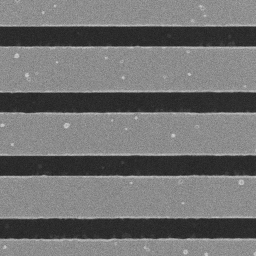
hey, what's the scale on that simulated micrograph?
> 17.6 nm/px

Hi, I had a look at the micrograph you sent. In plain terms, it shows lines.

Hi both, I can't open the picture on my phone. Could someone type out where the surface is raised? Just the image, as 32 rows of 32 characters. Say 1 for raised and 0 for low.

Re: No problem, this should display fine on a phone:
11111111111111111111111111111111
11111111111111111111111111111111
11111111111111111111111111111111
00000000000000000000000000000000
00000000000000000000000000000000
00000000000000000000000000000000
11111111111111111111111111111111
11111111111111111111111111111111
11111111111111111111111111111111
11111111111111111111111111111111
11111111111111111111111111111111
01000000000000000000000000000000
00000000000000000000000000000000
00000000000000000000000000000000
11111111111111111111111111111111
11111111111111111111111111111111
11111111111111111111111111111111
11111111111111111111111111111111
11111111111111111111111111111111
00000000000000000000000000000000
00000000000000000000000000000000
00000000000000000000000000000000
11111111111111111111111111111111
11111111111111111111111111111111
11111111111111111111111111111111
11111111111111111111111111111111
11111111111111111111111111111111
00000000000000000000000000000000
00000000000000000000000000000000
00000000000000000000000000000000
11111111111111111111111111111111
11111111111111111111111111111111